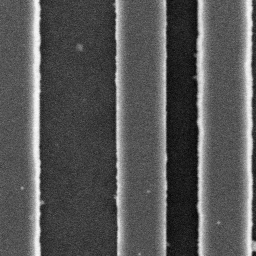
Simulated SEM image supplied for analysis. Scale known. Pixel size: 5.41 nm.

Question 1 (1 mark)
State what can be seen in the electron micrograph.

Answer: lines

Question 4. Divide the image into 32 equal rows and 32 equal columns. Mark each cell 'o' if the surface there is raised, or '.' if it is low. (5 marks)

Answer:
ooooo..........oooooo....oooooo.
ooooo..........oooooo....oooooo.
ooooo..........oooooo....oooooo.
ooooo..........oooooo....oooooo.
ooooo..........oooooo....oooooo.
ooooo..........oooooo....oooooo.
ooooo..........oooooo....oooooo.
ooooo..........oooooo....oooooo.
ooooo..........oooooo....oooooo.
ooooo..........oooooo....oooooo.
ooooo..........oooooo....oooooo.
ooooo..........oooooo....oooooo.
ooooo..........oooooo....oooooo.
ooooo..........oooooo....oooooo.
ooooo..........oooooo....oooooo.
ooooo..........oooooo....oooooo.
ooooo..........oooooo....oooooo.
ooooo..........oooooo....oooooo.
ooooo..........oooooo....oooooo.
ooooo..........oooooo....oooooo.
ooooo..........oooooo....oooooo.
ooooo..........oooooo....oooooo.
ooooo..........oooooo....oooooo.
ooooo..........oooooo....oooooo.
ooooo..........oooooo....oooooo.
ooooo..........oooooo....oooooo.
ooooo..........oooooo....oooooo.
ooooo..........oooooo....oooooo.
ooooo..........oooooo....oooooo.
ooooo..........oooooo....oooooo.
ooooo..........oooooo....oooooo.
ooooo..........oooooo....oooooo.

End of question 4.